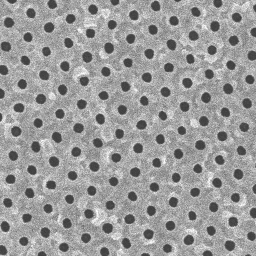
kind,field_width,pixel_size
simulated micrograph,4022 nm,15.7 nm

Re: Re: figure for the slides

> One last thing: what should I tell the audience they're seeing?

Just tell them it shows a regular array of holes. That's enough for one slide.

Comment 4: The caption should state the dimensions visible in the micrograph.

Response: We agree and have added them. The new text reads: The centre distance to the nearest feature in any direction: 366 nm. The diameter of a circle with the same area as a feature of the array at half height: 157 nm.